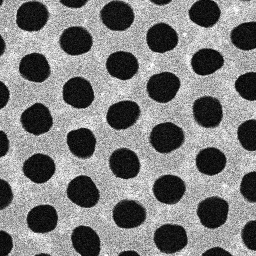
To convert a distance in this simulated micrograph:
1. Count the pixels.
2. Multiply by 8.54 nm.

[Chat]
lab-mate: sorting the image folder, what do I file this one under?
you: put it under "a regular array of holes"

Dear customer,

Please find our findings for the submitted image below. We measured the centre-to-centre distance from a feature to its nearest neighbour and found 0.415 microns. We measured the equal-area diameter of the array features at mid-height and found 262 nm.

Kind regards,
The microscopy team